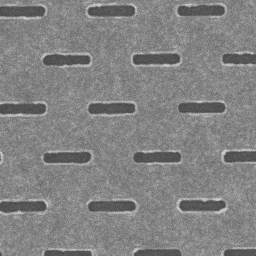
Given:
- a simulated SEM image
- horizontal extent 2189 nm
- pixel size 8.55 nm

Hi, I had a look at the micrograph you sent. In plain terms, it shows a regular array of holes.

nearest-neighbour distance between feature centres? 0.563 micrometres